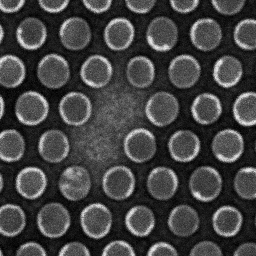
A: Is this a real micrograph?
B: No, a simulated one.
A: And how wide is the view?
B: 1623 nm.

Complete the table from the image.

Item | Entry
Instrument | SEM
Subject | a regular array of raised bodies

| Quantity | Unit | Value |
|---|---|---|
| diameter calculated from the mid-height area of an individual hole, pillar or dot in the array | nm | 200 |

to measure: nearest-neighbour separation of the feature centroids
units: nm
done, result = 272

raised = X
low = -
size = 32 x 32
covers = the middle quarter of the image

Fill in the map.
X----XXXXXXX----XXXXXX-----XXXXX
X---XXXXXXXX----XXXXXX----XXXXXX
X---XXXXXXXX----XXXXXX----XXXXXX
X----XXXXXXX----XXXXXX-----XXXXX
X----XXXXXX------XXXXX-----XXXXX
-------XXX--------XX--------XXXX
--------------------------------
-XXXX------------------XXX------
XXXXXX----------------XXXXXX----
XXXXXX---------------XXXXXXX----
XXXXXXX--------------XXXXXXX----
XXXXXXX--------------XXXXXXX----
XXXXXX---------------XXXXXXX----
XXXXXX---------------XXXXXXX----
XXXXX-----------------XXXXX-----
--------------------------------
------------------XX------------
----------------XXXXXX------XXXX
X--------------XXXXXXX-----XXXXX
X--------------XXXXXXXX---XXXXXX
X--------------XXXXXXXX---XXXXXX
X--------------XXXXXXXX----XXXXX
X---------------XXXXXX-----XXXXX
-----------------XXXXX------XXXX
------------------XX------------
--------------------------------
XXXXX------XXXXX------XXXXX-----
XXXXXX----XXXXXXX-----XXXXXX----
XXXXXX----XXXXXXX----XXXXXXX----
XXXXXX----XXXXXXXX---XXXXXXX----
XXX-XX----XXXXXXX----XXXXXXX----
XXXXXX----XXXXXXX----XXXXXXX----